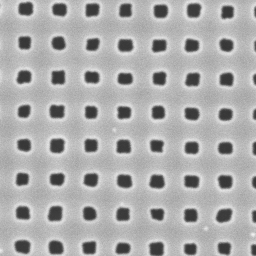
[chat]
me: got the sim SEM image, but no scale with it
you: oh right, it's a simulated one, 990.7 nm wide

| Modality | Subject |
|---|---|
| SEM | a regular array of holes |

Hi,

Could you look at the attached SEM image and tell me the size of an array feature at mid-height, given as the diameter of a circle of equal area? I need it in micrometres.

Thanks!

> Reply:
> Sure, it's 0.0589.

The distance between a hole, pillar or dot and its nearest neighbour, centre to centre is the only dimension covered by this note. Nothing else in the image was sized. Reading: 128 nanometers